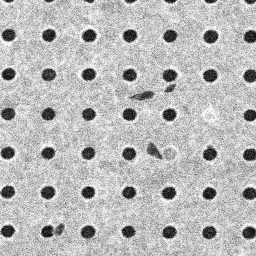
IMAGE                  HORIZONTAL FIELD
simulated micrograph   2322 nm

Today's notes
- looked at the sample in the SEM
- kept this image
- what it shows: a regular array of holes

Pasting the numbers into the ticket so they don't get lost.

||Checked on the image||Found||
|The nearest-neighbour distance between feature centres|354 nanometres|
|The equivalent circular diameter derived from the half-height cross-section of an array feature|126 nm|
